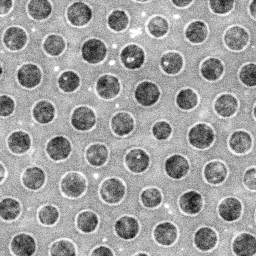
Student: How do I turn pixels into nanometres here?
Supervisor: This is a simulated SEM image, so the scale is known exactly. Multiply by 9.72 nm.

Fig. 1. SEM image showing a regular array of raised bodies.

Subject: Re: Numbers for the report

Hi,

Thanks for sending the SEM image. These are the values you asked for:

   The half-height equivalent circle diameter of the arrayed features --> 248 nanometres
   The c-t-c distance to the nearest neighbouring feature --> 378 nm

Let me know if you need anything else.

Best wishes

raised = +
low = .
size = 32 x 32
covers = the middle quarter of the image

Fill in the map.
...............+++++....++++++..
........................+++++...
+++.......++..............++....
++++.....+++++..................
++++....++++++.....+++..........
++++....++++++....+++++.........
+++.....++++++....++++++.....+++
........++++++...+++++++....++++
.........++++.....++++++....++++
..................+++++.....++++
....+..............+++......++++
..+++++.......................++
..++++++.....++++...............
..++++++....+++++...............
..++++++....++++++.....+++......
..++++++....++++++....+++++.....
...++++.....+++++.....+++++....+
............++++......+++++....+
+......................+++.....+
++.............................+
++....++++......................
++...++++++......+++............
++...++++++.....+++++...........
+....++++++....+++++++....+++++.
......+++++....+++++++...++++++.
.......+++.....++++++....+++++++
................+++++....++++++.
++++..............+.......+++++.
+++++......++.............++++..
++++++...++++++.................
++++++...++++++.................
++++++...++++++.....++++........